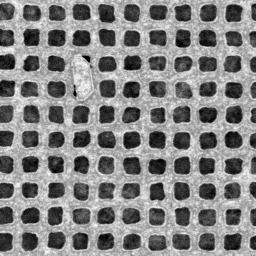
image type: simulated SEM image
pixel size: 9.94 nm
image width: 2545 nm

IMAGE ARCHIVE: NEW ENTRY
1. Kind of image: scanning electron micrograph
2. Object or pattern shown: a regular array of holes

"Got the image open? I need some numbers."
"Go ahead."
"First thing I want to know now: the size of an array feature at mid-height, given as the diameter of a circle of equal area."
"0.185 µm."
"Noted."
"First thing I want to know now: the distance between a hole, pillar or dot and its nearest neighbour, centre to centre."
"0.244 micrometres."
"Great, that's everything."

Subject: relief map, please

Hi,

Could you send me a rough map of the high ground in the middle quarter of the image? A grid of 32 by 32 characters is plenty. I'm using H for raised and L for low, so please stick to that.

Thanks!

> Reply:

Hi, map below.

HHHHHHHHLLLLLHHLLLLHHLLLLLHLLLLL
HHHHHHHHHLLLLHHLLLHHHHLLLHHHLLLL
HHHHHHHHHHHHHHHHHHHHHHHHHHHHHHHH
HHHHHHHHHHHHHHHHHHHHHHHHHHHHHHHH
HHHHHHHHHLLLLHHHLLHHHHLLLHHHHLHH
LHHHHHHHHLLLLHHLLLLHHLLLLLHHLLLH
LHHHHHHHHLLLLHHLLLLHHLLLLLHHLLLL
HHLHHHHHHLLLLHHLLLLHHHLLLHHHLLLL
HHHHHHHHHHLLHHHLLLHHHHHHHHHHLLLL
HHHHHHHHHHHHHHHHHHHHHHHHHHHHHHHH
HHHLLHHHHHLLHHHHHHHHHHHHHHHHLLLH
HHLLLLLHHLLLLHHLLLLHHHLLLHHLLLLL
HHLLLLHHHLLLLHHLLLLHHHLLLLHLLLLL
HHLLLLHHHLLLLHLLLLLHHHLLLLHLLLLL
HHLLLLHHHLLLHHHLLLHHHHLLLHHLLLLL
HHHHHHHHHHHHHHHHHHHHHHHHHHHHHHHH
HHHHHHHHHHHHHHHHHHHHHHHHHHHHHHHH
HHLLLLLHHLLLLHHLLLLHHHLLLHHHLLLH
HHLLLLLHLLLLLHHLLLLHHLLLLLHLLLLL
HHLLLLLHLLLLLHHLLLLHHLLLLLHLLLLL
HHLLLLHHHLLLLHHLLLLHHLLLLHHHLLLL
HHHHHHHHHHHHHHHHHHHHHHHHHHHHHHLH
HHHHHHHHHHHHHHHHHHHHHHHHHHHHHHHH
HHHLLLHHHLLLHHHLLLLHHHHHHHHHLLLL
HHLLLLHHLLLLLHHLLLLHHLLLLLHHLLLL
HHLLLLLHLLLLLHHLLLLHHLLLLLHLLLLL
HHLLLLHHLLLLLHHLLLLHHLLLLLHLLLLL
HHHHLLHHHLLLHHHHLLLHHHLLLHHHLLLH
HHHHHHHHHHHHHHHHHHHHHHHHHHHHHHHH
HHHHHHHHHHHHHHHHHHHHHHHHHHHHLLHH
HHLLLLHHLLLLLHHLLLLHHLLLLHHLLLLH
HHLLLLHHLLLLLHHLLLLHHLLLLHHLLLLL